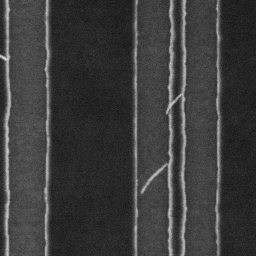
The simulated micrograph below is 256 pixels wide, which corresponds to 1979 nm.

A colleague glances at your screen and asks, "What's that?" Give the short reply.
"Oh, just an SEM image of lines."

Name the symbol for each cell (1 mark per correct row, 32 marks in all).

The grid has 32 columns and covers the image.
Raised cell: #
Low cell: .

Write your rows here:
#.....###########....##....#####
#.....###########....##....#####
#.....###########....##....#####
#.....###########....##....#####
#.....###########....##....#####
#.....###########....##....#####
#.....###########....##....#####
#.....###########....##....#####
#.....###########....##....#####
#.....###########....##....#####
#.....###########....##....#####
#.....###########....##....#####
#.....###########....##....#####
#.....###########....##....#####
#.....###########....##....#####
#.....###########....##....#####
#.....###########....##....#####
#.....###########....##....#####
#.....###########....##....#####
#.....###########....##....#####
#.....###########....##....#####
#.....###########....##....#####
#.....###########....##....#####
#.....###########....##....#####
#.....###########....##....#####
#.....###########....##....#####
#.....###########....##....#####
#.....###########....##....#####
#.....###########....##....#####
#.....###########....##....#####
#.....###########....##....#####
#.....###########....##....#####